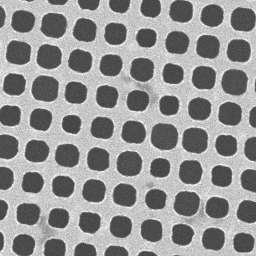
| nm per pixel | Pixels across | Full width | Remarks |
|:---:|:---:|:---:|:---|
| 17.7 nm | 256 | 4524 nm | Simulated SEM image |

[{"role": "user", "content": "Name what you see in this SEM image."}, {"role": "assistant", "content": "a regular array of holes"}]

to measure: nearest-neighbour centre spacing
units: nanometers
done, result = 547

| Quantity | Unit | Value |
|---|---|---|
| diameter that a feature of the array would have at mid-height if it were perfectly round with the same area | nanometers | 414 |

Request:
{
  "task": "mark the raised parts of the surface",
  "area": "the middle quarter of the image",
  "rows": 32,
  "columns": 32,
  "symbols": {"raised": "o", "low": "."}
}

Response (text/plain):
o......oo......oo......oo....ooo
oo.....oo.....oo......ooo.....oo
oooooooooo....ooo......oo.....oo
ooooooooooooooooo.....ooo.....oo
o...ooooooooooooooo.ooooo....ooo
o....oooo...oooooooooooooooooooo
......oo.....ooooo.ooooooooooooo
......oo......oo.....ooooooooooo
......oo.....ooo.....ooo....oooo
o....ooo.....ooo.....ooo.....oo.
ooooooooo....ooo.....ooo.....oo.
ooooooooooooooooo...oooo.....oo.
ooooooooooooooooooooooooo...ooo.
....oooo...ooooooooooooooooooooo
....ooo.....oooo...ooooooooooooo
....ooo......oo.....oo......oooo
....ooo......o......oo......oo..
oo.oooo.....oo......oo.......o..
oooooooo...oooo.....oo.......o..
oooooooooooooooo....oo......o...
...ooooooooooooooooooo......oo..
....oo....oooooooooooooo..oooo..
....oo.....ooo.....ooooooooooooo
....oo.....oo......ooooooooooooo
....oo.....oo.......oo....oooo..
...ooo.....oo.......o......oo...
ooooooo...ooo......ooo....ooo...
oooooooooooooo.....ooo....ooo...
..ooooooooooooooooooooooooooo...
..ooo.....oooooooooooooooooooo..
...oo.....ooo....ooooooooooooooo
..ooo.....oo......oooo..oooooooo